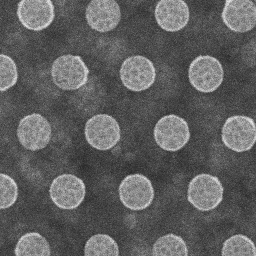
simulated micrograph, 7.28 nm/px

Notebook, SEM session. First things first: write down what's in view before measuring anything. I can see a regular array of raised bodies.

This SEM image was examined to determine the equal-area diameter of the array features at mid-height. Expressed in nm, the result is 246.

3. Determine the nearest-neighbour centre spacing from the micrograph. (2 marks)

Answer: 0.496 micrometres